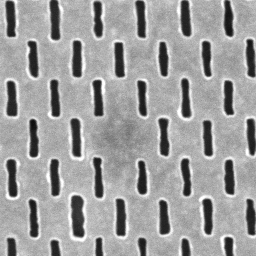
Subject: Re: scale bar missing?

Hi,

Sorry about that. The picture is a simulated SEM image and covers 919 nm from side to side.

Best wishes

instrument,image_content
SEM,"a regular array of holes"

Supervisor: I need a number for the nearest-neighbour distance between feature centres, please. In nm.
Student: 154